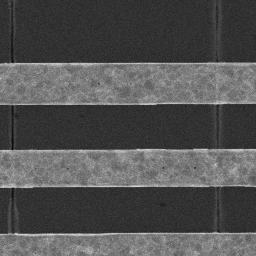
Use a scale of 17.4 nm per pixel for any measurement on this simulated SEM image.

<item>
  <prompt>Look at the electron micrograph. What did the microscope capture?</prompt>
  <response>wiring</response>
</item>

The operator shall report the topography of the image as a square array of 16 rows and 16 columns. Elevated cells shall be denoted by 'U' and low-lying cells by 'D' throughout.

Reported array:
DDDDDDDDDDDDDDDD
DDDDDDDDDDDDDDDD
DDDDDDDDDDDDDDDD
DDDDDDDDDDDDDDDD
UUUUUUUUUUUUUUUU
UUUUUUUUUUUUUUUU
DDDDDDDDDDDDDDDD
DDDDDDDDDDDDDDDD
DDDDDDDDDDDDDDDD
UUUUUUUUUUUUUUUU
UUUUUUUUUUUUUUUU
UUUUUUUUUUUUUUUU
DDDDDDDDDDDDDDDD
DDDDDDDDDDDDDDDD
DDDDDDDDDDDDDDDD
UUUUUUUUUUUUUUUU